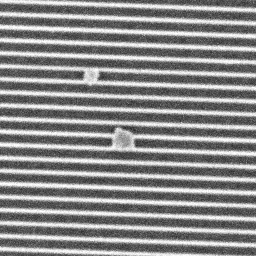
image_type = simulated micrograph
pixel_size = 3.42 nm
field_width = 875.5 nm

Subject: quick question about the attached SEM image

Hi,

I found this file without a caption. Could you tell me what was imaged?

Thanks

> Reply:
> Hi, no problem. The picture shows parallel lines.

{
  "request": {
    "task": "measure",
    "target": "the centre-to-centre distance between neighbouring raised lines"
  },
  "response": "13 pixels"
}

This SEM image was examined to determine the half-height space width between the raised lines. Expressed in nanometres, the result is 35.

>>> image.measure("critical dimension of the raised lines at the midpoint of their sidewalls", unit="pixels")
2.63